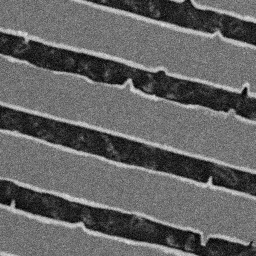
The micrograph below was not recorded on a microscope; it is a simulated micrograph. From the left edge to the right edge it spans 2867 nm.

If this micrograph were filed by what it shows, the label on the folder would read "one or a few lines or trenches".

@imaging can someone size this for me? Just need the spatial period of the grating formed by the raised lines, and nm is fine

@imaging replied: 814